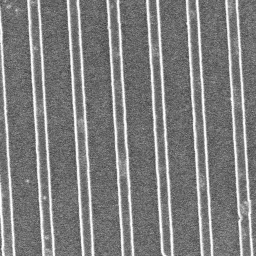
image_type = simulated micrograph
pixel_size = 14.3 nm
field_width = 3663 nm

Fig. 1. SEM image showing parallel lines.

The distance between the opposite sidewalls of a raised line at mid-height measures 10.9 pixels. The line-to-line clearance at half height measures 414 nanometers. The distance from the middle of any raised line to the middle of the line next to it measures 566 nm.